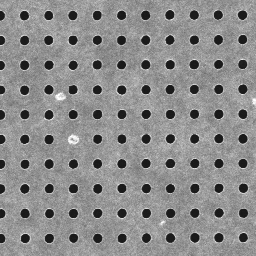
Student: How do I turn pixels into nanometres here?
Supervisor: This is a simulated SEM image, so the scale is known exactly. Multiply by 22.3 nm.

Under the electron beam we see a regular array of holes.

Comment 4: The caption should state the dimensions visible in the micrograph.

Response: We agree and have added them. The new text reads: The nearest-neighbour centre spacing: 24.2 px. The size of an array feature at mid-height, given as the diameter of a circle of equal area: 212 nanometers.